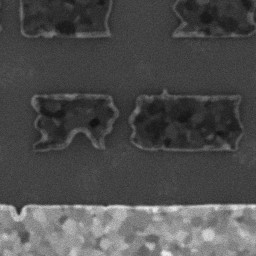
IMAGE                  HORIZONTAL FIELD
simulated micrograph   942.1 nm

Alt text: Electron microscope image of one or a few lines or trenches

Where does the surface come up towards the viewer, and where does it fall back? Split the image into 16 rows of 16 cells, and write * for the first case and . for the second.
.******....*****
.******....*****
................
................
................
................
..*****..******.
..*****.*******.
...****.*******.
................
................
................
................
****************
****************
****************